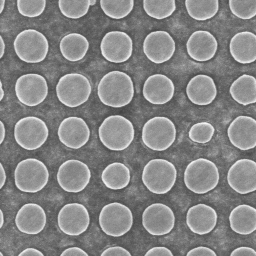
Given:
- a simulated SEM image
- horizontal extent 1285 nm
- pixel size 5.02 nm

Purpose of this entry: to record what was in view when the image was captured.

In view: a regular array of raised bodies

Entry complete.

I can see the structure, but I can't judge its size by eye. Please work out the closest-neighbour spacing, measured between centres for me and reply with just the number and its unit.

214 nm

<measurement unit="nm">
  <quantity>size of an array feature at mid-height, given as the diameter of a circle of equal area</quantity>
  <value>161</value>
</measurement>